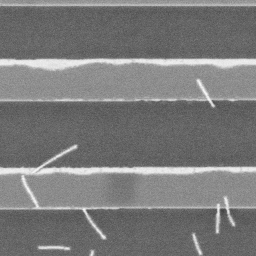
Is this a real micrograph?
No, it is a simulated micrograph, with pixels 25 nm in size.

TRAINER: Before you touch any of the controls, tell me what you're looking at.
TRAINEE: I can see lines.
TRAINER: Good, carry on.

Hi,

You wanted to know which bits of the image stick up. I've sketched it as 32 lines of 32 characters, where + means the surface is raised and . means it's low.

++++++++++++++++++++++++++++++++
................................
................................
................................
................................
................................
................................
................................
++++++++++++++++++++++++++++++++
++++++++++++++++++++++++++++++++
++++++++++++++++++++++++++++++++
++++++++++++++++++++++++++++++++
++++++++++++++++++++.+.++++.++..
................................
................................
................................
................................
................................
................................
................................
................................
++++++++++++++++++++++++++++++++
++++++++++++++++++++++++++++++++
++++++++++++++++++++++++++++++++
++++++++++++++++++++++++++++++++
++++++++++++++++++++++++++++++++
................................
................................
................................
................................
................................
................................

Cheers